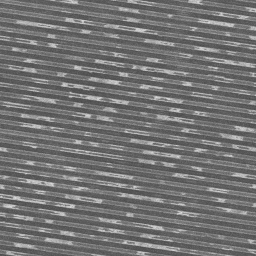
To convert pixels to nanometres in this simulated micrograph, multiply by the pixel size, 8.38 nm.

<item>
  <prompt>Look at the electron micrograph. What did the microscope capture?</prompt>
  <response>parallel lines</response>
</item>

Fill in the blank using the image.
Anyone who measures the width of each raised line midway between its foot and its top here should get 33.1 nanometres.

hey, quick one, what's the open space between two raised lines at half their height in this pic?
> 41.5 nanometers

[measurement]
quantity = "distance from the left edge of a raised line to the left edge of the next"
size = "77.1 nm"